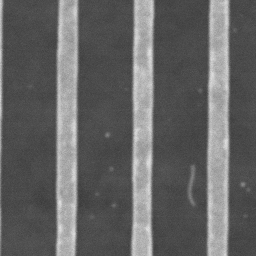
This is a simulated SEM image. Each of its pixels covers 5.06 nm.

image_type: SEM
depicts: wiring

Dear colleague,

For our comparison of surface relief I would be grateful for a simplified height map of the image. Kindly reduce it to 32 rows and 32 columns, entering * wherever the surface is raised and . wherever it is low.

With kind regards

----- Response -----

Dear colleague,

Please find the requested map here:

.......**........**.......**....
.......**........**.......**....
.......***.......**.......**....
.......***.......**.......**....
.......**........**.......**....
.......**........**.......**....
.......**........**.......**....
.......**........**.......**....
.......**........**.......**....
.......**........**.......**....
.......**........**.......**....
.......**........**.......**....
.......**........**.......**....
.......**........**.......**....
.......**........**.......**....
.......**........**.......**....
.......**........**.......**....
.......**........**.......**....
.......**........**.......**....
.......**........**.......**....
.......**........**.......**....
.......**........**.......**....
.......**........**.......**....
.......**........**.......**....
.......**........**.......**....
.......**........**.......**....
.......**........**.......**....
.......**........**.......**....
.......**........**.......**....
.......**........**.......**....
.......**........**.......**....
.......**........**.......**....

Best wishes